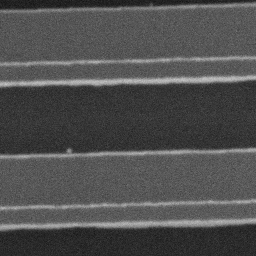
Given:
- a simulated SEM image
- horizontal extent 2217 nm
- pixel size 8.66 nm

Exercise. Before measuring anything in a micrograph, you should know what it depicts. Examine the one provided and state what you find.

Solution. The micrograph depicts lines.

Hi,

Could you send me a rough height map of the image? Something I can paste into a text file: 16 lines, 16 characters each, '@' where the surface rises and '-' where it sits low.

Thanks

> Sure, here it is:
---------@@@@@@@
@@@@@@@@@@@@@@@@
@@@@@@@@@@@@@@@@
@@@@@@@@@@@@@@@@
@@@@@@@@@@@@@@@@
----------------
----------------
----------------
----------------
-------------@@@
@@@@@@@@@@@@@@@@
@@@@@@@@@@@@@@@@
@@@@@@@@@@@@@@@@
@@@@@@@@@@@@@@@@
----------------
----------------